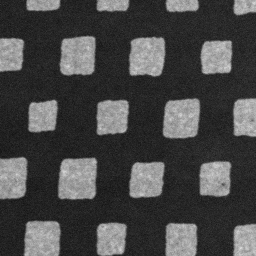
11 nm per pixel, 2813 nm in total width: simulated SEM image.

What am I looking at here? a regular array of raised bodies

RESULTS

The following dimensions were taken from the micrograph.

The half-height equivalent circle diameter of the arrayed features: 402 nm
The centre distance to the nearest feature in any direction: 0.76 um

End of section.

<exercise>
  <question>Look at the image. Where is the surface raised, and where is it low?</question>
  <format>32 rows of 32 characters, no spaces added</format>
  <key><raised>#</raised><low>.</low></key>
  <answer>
...####.....####.....####.....##
..............................#.
................................
................................
................................
###.....####.....###......##....
###.....####....#####....####...
###.....####....####.....####...
##......####....####.....####...
................................
................................
................................
........................#.......
....###.....####.....####....###
....###.....####.....####....###
....###.....####.....####....###
............###......####....###
................................
................................
................................
###.....####.....#.#......##....
###.....####.....###.....####...
###.....####....####.....####...
###....#####....####.....###....
###....#####....................
................................
................................
................................
...####.....####.....###......##
...####.....####.....###.....###
...####.....####.....###.....###
...####.....###......###.....###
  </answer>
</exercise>